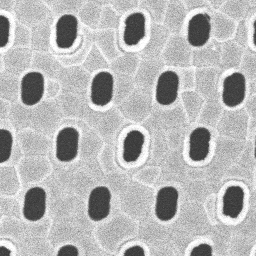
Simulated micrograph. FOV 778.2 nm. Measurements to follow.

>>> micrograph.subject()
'a regular array of holes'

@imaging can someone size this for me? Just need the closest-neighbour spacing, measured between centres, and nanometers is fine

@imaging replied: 198